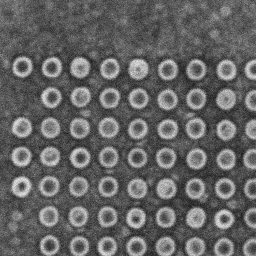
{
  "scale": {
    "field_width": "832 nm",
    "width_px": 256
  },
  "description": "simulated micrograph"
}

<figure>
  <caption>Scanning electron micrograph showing a regular array of raised bodies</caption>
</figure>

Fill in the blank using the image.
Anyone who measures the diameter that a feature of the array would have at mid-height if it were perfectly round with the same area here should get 0.0582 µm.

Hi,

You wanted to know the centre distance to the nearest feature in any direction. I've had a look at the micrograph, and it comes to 93.4 nanometres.